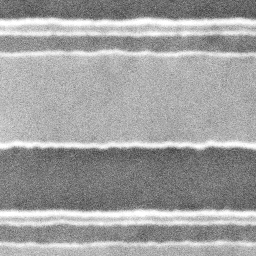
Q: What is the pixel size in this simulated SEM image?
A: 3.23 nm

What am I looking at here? lines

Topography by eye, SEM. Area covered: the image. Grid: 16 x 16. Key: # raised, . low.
................
################
################
################
################
################
################
################
################
................
................
................
................
################
################
################